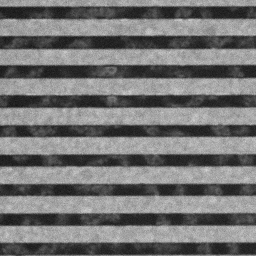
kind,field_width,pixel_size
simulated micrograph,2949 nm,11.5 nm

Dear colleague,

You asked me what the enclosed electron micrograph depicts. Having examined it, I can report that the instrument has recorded parallel lines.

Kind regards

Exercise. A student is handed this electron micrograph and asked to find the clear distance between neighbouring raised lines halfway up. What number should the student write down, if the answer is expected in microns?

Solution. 0.153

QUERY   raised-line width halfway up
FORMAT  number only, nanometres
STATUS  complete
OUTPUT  186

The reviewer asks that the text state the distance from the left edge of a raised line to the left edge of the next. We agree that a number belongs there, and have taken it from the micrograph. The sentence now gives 340 nm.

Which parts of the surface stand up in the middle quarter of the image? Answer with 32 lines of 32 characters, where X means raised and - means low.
-----------XX-------------------
----------XXX-------------------
----------X---------------------
--------------------------------
XXXXXXXXXXXXXXXXXXXXXXXXXXXXXXXX
XXXXXXXXXXXXXXXXXXXXXXXXXXXXXXXX
XXXXXXXXXXXXXXXXXXXXXXXXXXXXXXXX
XX--------XXXXXXXXX-XXXXXX-XXXX-
-----------XX-------------------
--------------------------------
--------------------------------
XXXXXXXXXXXXXXXXXXXXXXXXXXXXXXXX
XXXXXXXXXXXXXXXXXXXXXXXXXXXXXXXX
XXXXXXXXXXXXXXXXXXXXXXXXXXXXXXXX
XXXXXXXXXXXXXXXXXXXXXXXXXXXXXXXX
--------------------------------
---------------------X----------
--------------------------------
XXXXXXXXXXXXXXXXXXXXXXXXXXXXXXXX
XXXXXXXXXXXXXXXXXXXXXXXXXXXXXXXX
XXXXXXXXXXXXXXXXXXXXXXXXXXXXXXXX
XXXXXXXXXXXXXXXXXXXXXXXXXXXXXXXX
--------------------------------
--------------------------------
---------------------X----------
--------------------------------
XXXXXXXXXXXXXXXXXXXXXXXXXXXXXXXX
XXXXXXXXXXXXXXXXXXXXXXXXXXXXXXXX
XXXXXXXXXXXXXXXXXXXXXXXXXXXXXXXX
XXXXXXXXXXXXXXXXXXXXXXXXXXXXXXXX
--------------------------------
--------------------------------